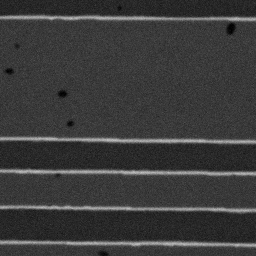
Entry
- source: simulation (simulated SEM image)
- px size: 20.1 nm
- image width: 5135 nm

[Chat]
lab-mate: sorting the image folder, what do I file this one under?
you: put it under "lines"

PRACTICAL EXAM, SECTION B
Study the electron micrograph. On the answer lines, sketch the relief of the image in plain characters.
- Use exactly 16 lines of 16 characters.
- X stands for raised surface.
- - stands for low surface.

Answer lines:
----------------
XXXXXXXXXXXXXXXX
XXXXXXXXXXXXXXXX
XXXXXXXXXXXXXXXX
XXXXXXXXXXXXXXXX
XXXXXXXXXXXXXXXX
XXXXXXXXXXXXXXXX
XXXXXXXXXXXXXXXX
XXXXXXXXXXXXXXXX
----------------
----------------
XXXXXXXXXXXXXXXX
XXXXXXXXXXXXXXXX
----------------
----------------
XXXXXXXXXXXXXXXX